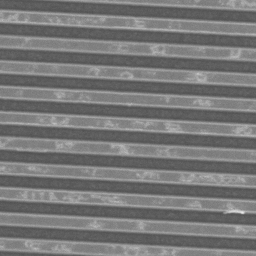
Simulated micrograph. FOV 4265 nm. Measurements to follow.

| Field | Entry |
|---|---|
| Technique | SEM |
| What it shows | parallel lines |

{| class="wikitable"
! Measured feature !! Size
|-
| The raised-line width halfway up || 206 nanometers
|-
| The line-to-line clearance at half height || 13.2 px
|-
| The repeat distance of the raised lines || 421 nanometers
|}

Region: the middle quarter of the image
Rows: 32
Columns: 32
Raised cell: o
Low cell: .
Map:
oooooo..........................
ooooooooooooooooooooooooo.......
oooooooooooooooooooooooooooooooo
.........ooooooooooooooooooooooo
............................oooo
................................
................................
ooooooooooooooooooo..o..........
oooooooooooooooooooooooooooooooo
..oo..oooooooooooooooooooooooooo
....................oo..oooooooo
................................
................................
oooooooooooooo..................
oooooooooooooooooooooooooooooooo
oooooooooooooooooooooooooooooooo
.................ooooooooooooooo
................................
................................
ooooooo.........................
oooooooooooooooooooooooooo......
oooooooooooooooooooooooooooooooo
..........oooooooooooooooooooooo
.............................ooo
................................
................................
ooooooooooooooooooo.............
oooooooooooooooooooooooooooooooo
...ooooooooooooooooooooooooooooo
.....................ooooooooooo
................................
................................